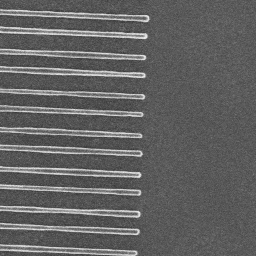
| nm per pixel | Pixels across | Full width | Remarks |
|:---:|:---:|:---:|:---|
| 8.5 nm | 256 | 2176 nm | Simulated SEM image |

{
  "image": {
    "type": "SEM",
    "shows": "parallel lines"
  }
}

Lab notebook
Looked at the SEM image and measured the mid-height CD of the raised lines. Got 0.0361 micrometres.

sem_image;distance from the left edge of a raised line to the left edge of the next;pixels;19.5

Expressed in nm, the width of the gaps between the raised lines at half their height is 123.